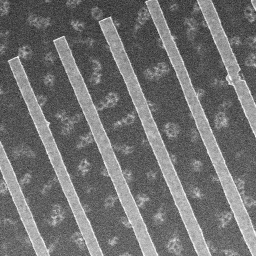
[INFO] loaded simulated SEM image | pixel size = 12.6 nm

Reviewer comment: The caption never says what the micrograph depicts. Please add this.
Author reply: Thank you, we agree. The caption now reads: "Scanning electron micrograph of parallel lines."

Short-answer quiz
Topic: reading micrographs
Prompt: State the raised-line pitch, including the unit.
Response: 622 nm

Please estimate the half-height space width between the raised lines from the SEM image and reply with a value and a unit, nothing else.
0.478 µm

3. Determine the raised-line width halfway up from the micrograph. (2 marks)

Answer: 11.8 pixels